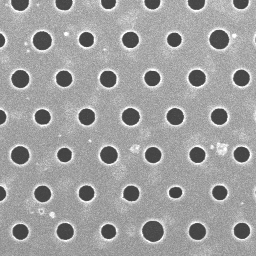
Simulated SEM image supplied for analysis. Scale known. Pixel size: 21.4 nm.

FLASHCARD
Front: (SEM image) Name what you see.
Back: a regular array of holes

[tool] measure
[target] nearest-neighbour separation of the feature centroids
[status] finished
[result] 938 nm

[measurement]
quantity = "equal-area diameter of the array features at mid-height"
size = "361 nanometres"